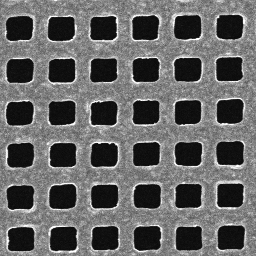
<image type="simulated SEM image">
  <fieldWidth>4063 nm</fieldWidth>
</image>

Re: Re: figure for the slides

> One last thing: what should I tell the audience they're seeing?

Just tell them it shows a regular array of holes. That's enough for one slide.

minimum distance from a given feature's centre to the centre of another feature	41.6	pixels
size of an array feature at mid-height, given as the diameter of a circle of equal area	27.9	px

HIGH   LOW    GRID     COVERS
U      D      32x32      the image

UUUUUUUUUUUUUUUUUUUUUUUUUUUUUUUU
UUUUUUUUUUUUUUUUUUUUUUUUUUUUUUUU
UDDDUUDDDUUDDDDUUDDDUUDDDUUDDDUU
UDDDUUDDDUUDDDDUDDDDUUDDDUUDDDUU
UDDDUUDDDUUDDDDUUDDDUUDDDUUDDDUU
UUUUUUUUUUUUUUUUUUUUUUUUUUUUUUUU
UUUUUUUUUUUUUUUUUUUUUUUUUUUUUUUU
UDDDUUUDDUUUDDUUUDDDUUDDDUUDDDUU
UDDDUUDDDUUDDDDUUDDDUUDDDUUDDDUU
UDDDUUDDDUUDDDDUUDDDUUDDDUUDDDUU
UUUUUUUUUUUUUUUUUUUUUUUUUUUUUUUU
UUUUUUUUUUUUUUUUUUUUUUUUUUUUUUUU
UUUUUUUUUUUUUUUUUUUUUUUDUUUUDDUU
UDDDUUDDDDUDDDDUUDDDUUDDDUUDDDUU
UDDDUUDDDUUDDDDUUDDDUUDDDUUDDDUU
UDDDUUDDDUUUDDUUUDDUUUDDUUUUUUUU
UUUUUUUUUUUUUUUUUUUUUUUUUUUUUUUU
UUUUUUUUUUUUUUUUUUUUUUUUUUUUUUUU
UDDDUUDDDUUDDDDUUDDDUUDDDUUDDDUU
UDDDUUDDDDUDDDDUUDDDUUDDDUUDDDUU
UDDDUUDDDUUUDDDUUDDDUUDDDUUUDDUU
UUUUUUUUUUUUUUUUUUUUUUUUUUUUUUUU
UUUUUUUUUUUUUUUUUUUUUUUUUUUUUUUU
UDDDUUDDDUUUDDDUUDDDUUDDDUUDDDUU
UDDDUUDDDDUDDDDUUDDDUUDDDUUDDDUU
UDDDUUDDDUUDDDDUUDDDUUDDDUUDDDUU
UUUUUUUUUUUUUUUUUUUUUUUUUUUUUUUU
UUUUUUUUUUUUUUUUUUUUUUUUUUUUUUUU
UUDDUUUDDUUUDDDUUDDDUUDDDUUDDDUU
UDDDUUDDDDUDDDDUUDDDUUDDDUUDDDDU
UDDDUUDDDDUDDDDUUDDDUUDDDUUDDDUU
UUUUUUUUUUUUUUUUUUUUUUUUUUUUUUUU